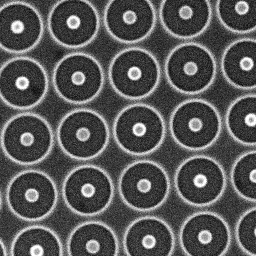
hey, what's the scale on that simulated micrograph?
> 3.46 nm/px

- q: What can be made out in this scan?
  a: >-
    an array of small figures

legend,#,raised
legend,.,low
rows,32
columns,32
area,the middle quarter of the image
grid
.........###...........###....##
.........###.....##....###....##
...##....###....###.....##.....#
..###.....##.....#.....###......
..###....###...........####.....
.........####..........#####....
.........####.........#######...
........#######......###########
.......#########################
###############################.
##################..#########...
###############.......######....
##......######.........#####....
#........#####..........###.....
..........###...........###....#
..........###.....##.....##.....
....##.....##....###.....##.....
...###.....##.....##.....##.....
....##.....##...........####....
...........###..........#####...
..........#####........#######..
.........#######......##########
#.......########################
####.###########################
###############################.
#################......######...
###......#######........#####...
##........#####..........####...
#..........####...........##....
#..........###.....##.....##....
.....##.....##.....##.....##....
.....##.....##.....##.....###...